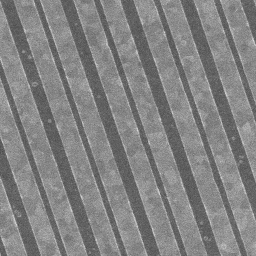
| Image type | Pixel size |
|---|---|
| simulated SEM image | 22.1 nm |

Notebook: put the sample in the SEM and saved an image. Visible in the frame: parallel lines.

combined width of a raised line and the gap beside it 0.627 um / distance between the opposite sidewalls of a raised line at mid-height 408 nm